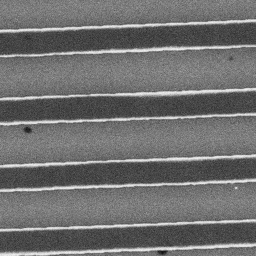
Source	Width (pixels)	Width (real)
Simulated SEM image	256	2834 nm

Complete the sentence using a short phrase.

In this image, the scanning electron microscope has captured lines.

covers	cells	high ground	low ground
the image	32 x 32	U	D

DDDDDDDDDDDDDDDDDDDDDDDDDDDDDDDD
DDDDDDDDDDDDDDDDDDDDDDDDDDDDDDDD
DDDDDDDDDDDDDDDDDDDDDDDDDDDDDDDD
DDDDDDDDDUUUUUUUUUUUUUUUUUUUUUUU
UUUUUUUUUUUUUUUUUUUUUUUUUUUUUUUU
UUUUUUUUUUUUUUUUUUUUUUUUUUUUUUUU
UUUUUUUUUUUUUUDDDDDDDDDDDDDDDDDD
DDDDDDDDDDDDDDDDDDDDDDDDDDDDDDDD
DDDDDDDDDDDDDDDDDDDDDDDDDDDDDDDD
DDDDDDDDDDDDDDDDDDDDDDDDDDDDDDDD
DDDDDDDDDDDDDDDDDDDDDDDDDDDDDDDD
DDDDDDDDDDDDDDDDDDDDDDDDUUUUUUUU
UUUUUUUUUUUUUUUUUUUUUUUUUUUUUUUU
UUUUUUUUUUUUUUUUUUUUUUUUUUUUUUUU
UUUUUUUUUUUUUUUUUUUUUUUUUUDDDDDD
UUDDDDDDDDDDDDDDDDDDDDDDDDDDDDDD
DDDDDDDDDDDDDDDDDDDDDDDDDDDDDDDD
DDDDDDDDDDDDDDDDDDDDDDDDDDDDDDDD
DDDDDDDDDDDDDDDDDDDDDDDDDDDDDDDD
DDDDDDDDDDDDDDDDDDDDDDDDDDDDDDUU
DDDDDDUUUUUUUUUUUUUUUUUUUUUUUUUU
UUUUUUUUUUUUUUUUUUUUUUUUUUUUUUUU
UUUUUUUUUUUUUUUUUUUUUUUUUUUUUUUU
UUUUUUUUDDDDDDDDDDDDDDDDDDDDDDDD
DDDDDDDDDDDDDDDDDDDDDDDDDDDDDDDD
DDDDDDDDDDDDDDDDDDDDDDDDDDDDDDDD
DDDDDDDDDDDDDDDDDDDDDDDDDDDDDDDD
DDDDDDDDDDDDDDDDDDDDDDDDDDDDDDDD
DDDDDDUUUUUUUUUUUUUUUUUUUUUUUUUU
UUUUUUUUUUUUUUUUUUUUUUUUUUUUUUUU
UUUUUUUUUUUUUUUUUUUUUUUUUUUUUUUU
UUUUUUUUUUUUDDDDDDDDDDDDDDDDDDDD